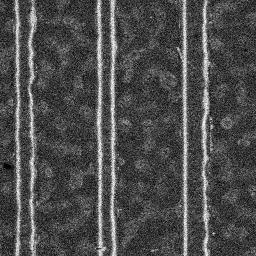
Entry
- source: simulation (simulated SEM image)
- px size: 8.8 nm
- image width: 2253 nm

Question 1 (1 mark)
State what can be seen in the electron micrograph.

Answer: one or a few lines or trenches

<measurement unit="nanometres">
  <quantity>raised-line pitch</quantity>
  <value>749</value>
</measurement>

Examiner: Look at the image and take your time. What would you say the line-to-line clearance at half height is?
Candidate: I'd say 0.618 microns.